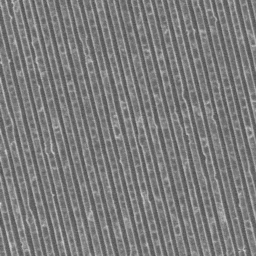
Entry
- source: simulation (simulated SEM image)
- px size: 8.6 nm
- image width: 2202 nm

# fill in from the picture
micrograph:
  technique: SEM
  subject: parallel lines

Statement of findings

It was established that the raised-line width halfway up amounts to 59.6 nm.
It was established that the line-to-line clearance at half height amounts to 41.9 nanometers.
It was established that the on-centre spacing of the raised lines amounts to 100 nm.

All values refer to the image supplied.